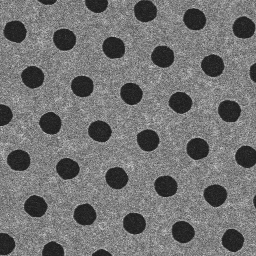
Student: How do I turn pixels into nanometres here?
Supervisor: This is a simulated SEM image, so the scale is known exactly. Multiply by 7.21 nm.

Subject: a regular array of holes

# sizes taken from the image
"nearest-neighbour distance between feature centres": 350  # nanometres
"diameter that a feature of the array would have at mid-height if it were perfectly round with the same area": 160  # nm